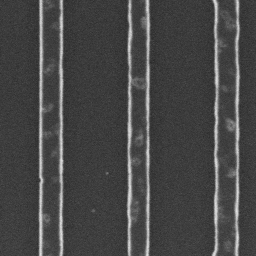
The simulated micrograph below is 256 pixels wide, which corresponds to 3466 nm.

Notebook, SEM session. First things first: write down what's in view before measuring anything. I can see one or a few lines or trenches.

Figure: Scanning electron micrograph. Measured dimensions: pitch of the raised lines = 1.19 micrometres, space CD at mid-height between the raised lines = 912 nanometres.